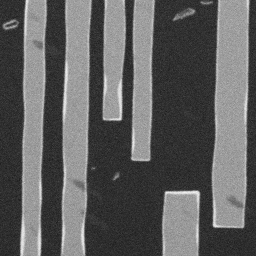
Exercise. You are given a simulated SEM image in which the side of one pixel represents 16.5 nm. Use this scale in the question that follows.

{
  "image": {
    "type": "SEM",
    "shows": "groups of lines, slits or small figures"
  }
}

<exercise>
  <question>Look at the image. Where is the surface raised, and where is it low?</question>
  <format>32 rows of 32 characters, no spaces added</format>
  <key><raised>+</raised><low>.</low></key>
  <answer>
...+++..+++..+++.++........++++.
...+++..+++..+++.++........++++.
...+++..+++..+++.++........++++.
...+++..+++..+++.++........++++.
...+++..+++..+++.++........++++.
...+++..+++..+++.++........++++.
...+++..+++..+++.++........++++.
...+++..+++..++..++........++++.
...+++..+++..++..++........++++.
...+++..+++..++..++........++++.
...+++..+++..++..++........++++.
...+++..+++..++..++........++++.
...++...+++..++..++........++++.
...++...+++..++..++........++++.
...++...+++..++..++........++++.
...++...+++......++........++++.
...++...+++......++........++++.
...++...+++......++........++++.
...++...+++......++........++++.
...++...+++......++........++++.
...++...+++................++++.
...++...+++................++++.
...++...+++................++++.
...++...+++................++++.
...++...+++..........++++..++++.
...++...+++..........++++..++++.
...++...+++..........++++..+++..
...++...+++.........+++++..+++..
...++...++..........+++++.......
...++...++..........+++++.......
...++...++...........++++.......
...++...+++..........++++.......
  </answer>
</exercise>